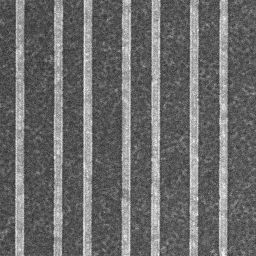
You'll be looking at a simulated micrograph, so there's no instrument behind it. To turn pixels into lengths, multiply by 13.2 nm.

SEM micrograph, parallel lines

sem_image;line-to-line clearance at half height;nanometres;362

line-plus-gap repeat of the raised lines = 450 nm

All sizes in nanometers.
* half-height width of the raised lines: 92.7